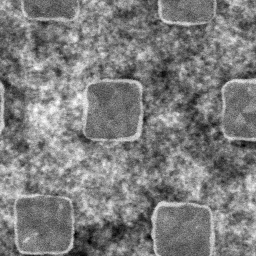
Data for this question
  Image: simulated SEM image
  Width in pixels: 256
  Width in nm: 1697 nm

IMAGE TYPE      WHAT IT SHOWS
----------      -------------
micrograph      raised bodies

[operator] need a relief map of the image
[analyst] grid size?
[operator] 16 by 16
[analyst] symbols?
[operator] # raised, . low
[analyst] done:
.####.....###...
............#...
................
................
................
......###.....##
.....####.....##
.....####.....##
......##......##
................
................
................
.###............
.####.....###...
.####.....###...
.###......###...